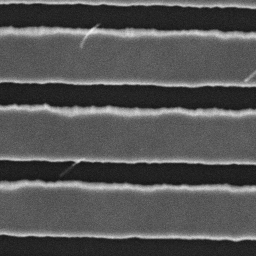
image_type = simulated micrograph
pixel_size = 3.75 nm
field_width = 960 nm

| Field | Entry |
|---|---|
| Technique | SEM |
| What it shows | lines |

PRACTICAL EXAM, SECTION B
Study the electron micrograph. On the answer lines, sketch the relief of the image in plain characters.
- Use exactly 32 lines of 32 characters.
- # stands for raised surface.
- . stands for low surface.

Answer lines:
...........#####################
................................
................................
................................
################################
################################
################################
################################
################################
################################
.........#######################
................................
................................
########.######.................
################################
################################
################################
################################
################################
################################
.........................#######
................................
................................
################################
################################
################################
################################
################################
################################
..##############################
................................
................................